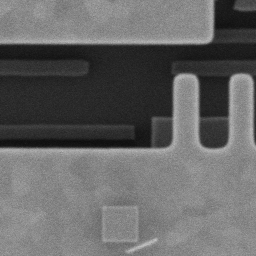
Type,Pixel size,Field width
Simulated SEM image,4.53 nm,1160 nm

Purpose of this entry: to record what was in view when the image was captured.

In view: wiring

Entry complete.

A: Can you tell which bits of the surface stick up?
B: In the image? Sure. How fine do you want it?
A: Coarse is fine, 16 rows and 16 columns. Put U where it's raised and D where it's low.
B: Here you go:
UUUUUUUUUUUUUDDD
UUUUUUUUUUUUUDDD
UUUUUUUUUUUUUDDD
DDDDDDDDDDDDDDDD
DDDDDDDDDDDDDDDD
DDDDDDDDDDDUDDUU
DDDDDDDDDDDUDDUU
DDDDDDDDDDDUDDUU
DDDDDDDDDDDUDDUU
UUUUUUUUUUUUUUUU
UUUUUUUUUUUUUUUU
UUUUUUUUUUUUUUUU
UUUUUUUUUUUUUUUU
UUUUUUUUUUUUUUUU
UUUUUUUUUUUUUUUU
UUUUUUUUUUUUUUUU